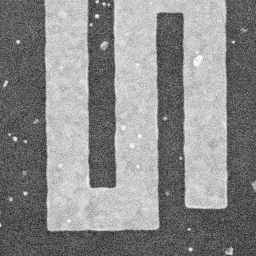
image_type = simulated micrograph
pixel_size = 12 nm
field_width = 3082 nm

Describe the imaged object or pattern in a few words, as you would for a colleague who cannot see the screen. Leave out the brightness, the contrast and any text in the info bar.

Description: groups of lines, slits or small figures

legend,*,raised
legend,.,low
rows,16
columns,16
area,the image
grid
...**..*******..
...**..***..**..
...**..***..**..
...**..***..**..
...**..***..**..
...**..***..**..
...**..***..**..
...***.***..**..
...***.***..**..
...***.***..**..
...***.***..**..
...***.***..**..
...*******..**..
...*******......
................
................